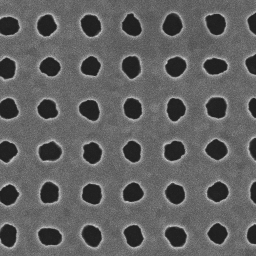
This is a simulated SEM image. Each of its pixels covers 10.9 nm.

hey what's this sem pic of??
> a regular array of holes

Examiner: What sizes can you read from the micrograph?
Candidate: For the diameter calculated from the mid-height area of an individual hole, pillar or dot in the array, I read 219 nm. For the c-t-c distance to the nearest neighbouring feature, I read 0.455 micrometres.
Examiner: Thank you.